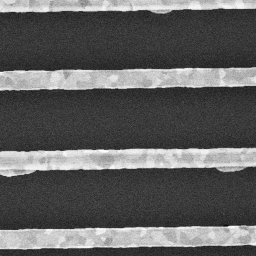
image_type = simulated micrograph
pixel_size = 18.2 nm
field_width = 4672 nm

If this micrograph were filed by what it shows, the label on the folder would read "lines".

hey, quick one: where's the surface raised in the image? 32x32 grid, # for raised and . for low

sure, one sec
################################
................................
................................
................................
................................
................................
................................
................................
................................
################################
################################
................................
................................
................................
................................
................................
................................
................................
................................
################################
################################
................................
................................
................................
................................
................................
................................
................................
.........................#######
################################
################################
................................